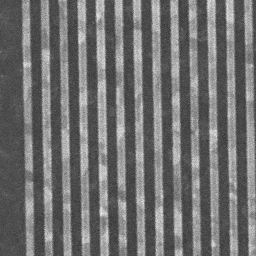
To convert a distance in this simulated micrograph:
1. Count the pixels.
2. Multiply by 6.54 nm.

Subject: parallel lines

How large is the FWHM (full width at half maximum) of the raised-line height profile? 44.9 nanometers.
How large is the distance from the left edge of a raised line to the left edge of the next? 121 nanometres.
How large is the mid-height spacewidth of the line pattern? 79.3 nanometres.